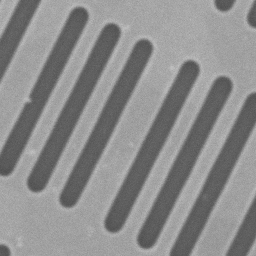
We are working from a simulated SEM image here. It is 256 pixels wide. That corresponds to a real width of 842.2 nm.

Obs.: groups of lines, slits or small figures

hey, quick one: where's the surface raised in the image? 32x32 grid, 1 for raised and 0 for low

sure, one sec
11000111111111111111111111100110
11001111100111111111111111111110
10001111000111111111111111111110
10001111000110011111111111111111
00011110001100011111111111111111
00011110001100011001111111111111
00111100011000110001111111111111
00111100011000110001111011111111
01111000110001100011110001111111
01111000110001100011110001101111
11110001100011000111100011000111
11110001100011000111100011000111
11100011000110001111000111000110
11100011000110001111000110001100
11000110001100011110001100011100
11000110001100011110001100011000
10001100011000111100011100111001
10001100011000111100011000110001
00011000110001111000111001110001
00011000110001111000110001100011
00110001100011110001100011100011
00110001100011110001100011000111
11100011000111100011100011000111
11110011000111100011000110001111
11111110001111000110001110001111
11111111001111000110001100011110
11111111111110001110011100011110
11111111111110001100011000111100
11111111111110011100111000111100
11111111111111111000110001111000
11111111111111111001110001111000
01111111111111111111100011110001